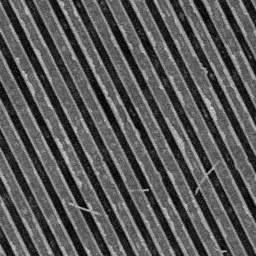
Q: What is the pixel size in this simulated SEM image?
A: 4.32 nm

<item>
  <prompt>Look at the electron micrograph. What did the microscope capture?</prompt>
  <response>parallel lines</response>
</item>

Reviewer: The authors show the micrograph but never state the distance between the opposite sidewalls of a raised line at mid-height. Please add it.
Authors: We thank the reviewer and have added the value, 50.7 nm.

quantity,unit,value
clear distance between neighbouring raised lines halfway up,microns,0.0425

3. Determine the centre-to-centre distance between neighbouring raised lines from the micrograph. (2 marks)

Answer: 93.4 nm